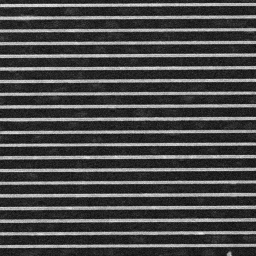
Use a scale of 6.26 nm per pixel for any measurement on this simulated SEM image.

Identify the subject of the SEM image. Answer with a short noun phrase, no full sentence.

parallel lines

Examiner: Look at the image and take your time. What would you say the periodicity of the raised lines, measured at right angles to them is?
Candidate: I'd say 79.3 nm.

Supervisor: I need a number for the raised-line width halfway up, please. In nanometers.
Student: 15.7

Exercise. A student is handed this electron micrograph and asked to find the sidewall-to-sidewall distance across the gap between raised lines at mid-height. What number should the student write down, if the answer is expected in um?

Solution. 0.0642